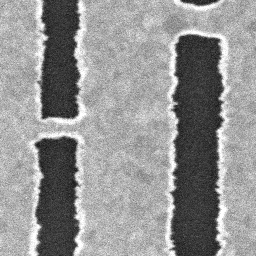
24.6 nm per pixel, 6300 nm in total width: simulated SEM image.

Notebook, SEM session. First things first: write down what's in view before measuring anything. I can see one or a few lines or trenches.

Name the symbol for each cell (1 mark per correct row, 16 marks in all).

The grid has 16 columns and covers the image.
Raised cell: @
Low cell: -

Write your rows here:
@@@--@@@@@@@@@@@
@@@--@@@@@@@@@@@
@@@--@@@@@@---@@
@@@--@@@@@@---@@
@@---@@@@@@---@@
@@---@@@@@@---@@
@@---@@@@@@---@@
@@@@-@@@@@@---@@
@@@--@@@@@@---@@
@@---@@@@@@---@@
@@---@@@@@@---@@
@@---@@@@@@---@@
@@---@@@@@@---@@
@@---@@@@@@---@@
@@---@@@@@@---@@
@@---@@@@@@---@@